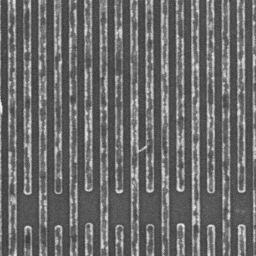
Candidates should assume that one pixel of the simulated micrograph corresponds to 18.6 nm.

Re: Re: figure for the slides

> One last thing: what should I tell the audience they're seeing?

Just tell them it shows parallel lines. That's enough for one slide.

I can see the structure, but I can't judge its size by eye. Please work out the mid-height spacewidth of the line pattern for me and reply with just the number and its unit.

158 nm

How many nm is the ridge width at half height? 132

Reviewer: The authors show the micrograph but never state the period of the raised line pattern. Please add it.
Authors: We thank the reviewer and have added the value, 284 nm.